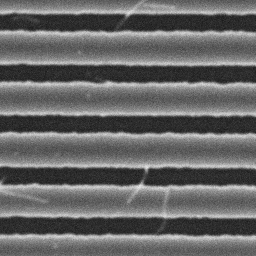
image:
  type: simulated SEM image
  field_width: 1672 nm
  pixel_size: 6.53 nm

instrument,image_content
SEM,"lines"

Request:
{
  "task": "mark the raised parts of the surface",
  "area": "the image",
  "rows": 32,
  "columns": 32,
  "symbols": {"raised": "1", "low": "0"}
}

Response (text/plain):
11111111111111111111111111111111
11111111111111111111111111111111
00000000000000000000000000000000
00000000000000000000000000000000
11111111111111111111111111111111
11111111111111111111111111111111
11111111111111111111111111111111
11111111111111111111111111111111
00000000000000000000000000000000
00000000000000000000000000000000
11111111111101111011111111100111
11111111111111111111111111111111
11111111111111111111111111111111
11111111111111111111111111111111
00000000000000000000000000000000
00000000000000000000000000000000
00000000000000000000000000000000
11111111111111111111111111111111
11111111111111111111111111111111
11111111111111111111111111111111
11111111111111111111111111111111
00000000000000000000000000000000
00000000000000000000000000000000
11111111111111111111111111111111
11111111111111111111111111111111
11111111111111111111111111111111
11111111111111111111111111111111
00000000000000000000000000000000
00000000000000000000000000000000
11111111111111111111111101011100
11111111111111111111111111111111
11111111111111111111111111111111